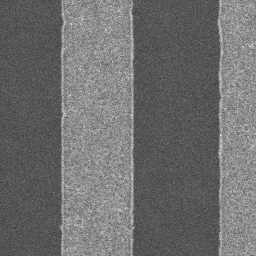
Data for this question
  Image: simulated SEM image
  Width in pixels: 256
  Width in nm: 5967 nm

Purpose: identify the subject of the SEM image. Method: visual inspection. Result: one or a few lines or trenches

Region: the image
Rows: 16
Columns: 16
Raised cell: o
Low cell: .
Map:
....oooo......oo
....oooo......oo
....oooo......oo
....oooo......oo
....oooo......oo
....oooo......oo
....oooo......oo
....oooo......oo
....oooo......oo
....oooo......oo
....oooo......oo
....oooo......oo
....oooo......oo
....oooo......oo
....oooo......oo
....oooo......oo